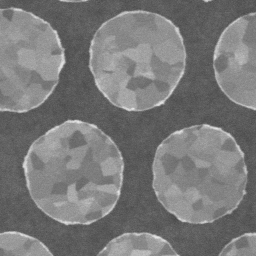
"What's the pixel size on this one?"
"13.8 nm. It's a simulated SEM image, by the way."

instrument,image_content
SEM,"raised bodies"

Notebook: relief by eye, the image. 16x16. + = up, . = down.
................
+++....++++...++
++++..+++++...++
++++..++++++.+++
++++..+++++..+++
+++...+++++...++
++.....+++.....+
................
...++++....+++..
..+++++...+++++.
.+++++++..+++++.
..++++++..+++++.
..+++++...+++++.
...+++.....+++..
................
+++....++++...++